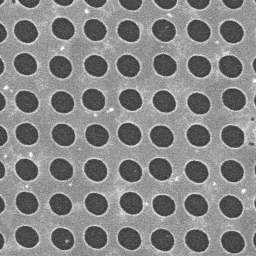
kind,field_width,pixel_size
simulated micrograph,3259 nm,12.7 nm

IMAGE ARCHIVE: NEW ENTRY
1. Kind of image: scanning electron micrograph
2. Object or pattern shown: a regular array of holes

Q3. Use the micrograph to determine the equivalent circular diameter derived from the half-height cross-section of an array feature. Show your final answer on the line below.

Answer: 23.4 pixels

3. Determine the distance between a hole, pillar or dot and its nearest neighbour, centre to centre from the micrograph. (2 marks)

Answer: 423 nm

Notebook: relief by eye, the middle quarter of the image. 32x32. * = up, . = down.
..***......**......***......***.
..***......**......****.....***.
..****....****....*****.....****
.*******************************
********************************
********************************
*****....******...**************
.****.....****.....****....*****
..**......****.....***......***.
...*.......***......**......***.
...**.....****.....***......***.
..****...*******..*****.....****
********************************
********************************
********************************
.*****....****....*****..*******
..***......**......***.....****.
...**......**.......*......****.
...**......***.....**.......***.
...***.....***.....***.....****.
.******...*************...******
********************************
********************************
*******.***************.********
.****.....****....***.....*****.
..***......***.....**......***..
...**......**.......*......***..
..***......***......*......***..
..****....*****....***....*****.
********.*******..********.*****
********************************
*************.******************